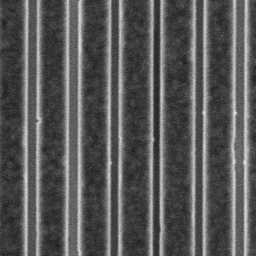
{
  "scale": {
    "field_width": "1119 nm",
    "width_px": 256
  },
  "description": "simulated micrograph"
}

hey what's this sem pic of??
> parallel lines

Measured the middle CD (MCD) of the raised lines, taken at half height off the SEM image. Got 140 nm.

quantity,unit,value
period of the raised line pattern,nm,182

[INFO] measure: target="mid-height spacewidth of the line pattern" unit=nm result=39.9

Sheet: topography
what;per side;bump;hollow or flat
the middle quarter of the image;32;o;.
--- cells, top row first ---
o...oooooooo..oooooooo..oooooooo
o...oooooooo..oooooooo..oooooooo
o...oooooooo..oooooooo..oooooooo
o...oooooooo..oooooooo..oooooooo
o...oooooooo..oooooooo..oooooooo
o...oooooooo..oooooooo..oooooooo
o...oooooooo..oooooooo..oooooooo
o...oooooooo..oooooooo..oooooooo
o...oooooooo..oooooooo..oooooooo
o...ooooooo...oooooooo..oooooooo
o...ooooooo...oooooooo..oooooooo
o...ooooooo...oooooooo..oooooooo
o...ooooooo...oooooooo..oooooooo
o...ooooooo...oooooooo..oooooooo
o...ooooooo...oooooooo..oooooooo
o...ooooooo...oooooooo..oooooooo
o...ooooooo...oooooooo..oooooooo
o...ooooooo...oooooooo..oooooooo
o...ooooooo...oooooooo..oooooooo
o...ooooooo...oooooooo..oooooooo
o...ooooooo...oooooooo..oooooooo
o...ooooooo...oooooooo..oooooooo
o...ooooooo...oooooooo..oooooooo
o...ooooooo...oooooooo..oooooooo
o...oooooooo..oooooooo..oooooooo
o...ooooooo...oooooooo..oooooooo
o...ooooooo...oooooooo..oooooooo
o...ooooooo...oooooooo..oooooooo
o...ooooooo...oooooooo..oooooooo
o...ooooooo...oooooooo..oooooooo
o...ooooooo...oooooooo..oooooooo
o...ooooooo...oooooooo..oooooooo